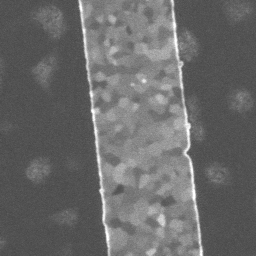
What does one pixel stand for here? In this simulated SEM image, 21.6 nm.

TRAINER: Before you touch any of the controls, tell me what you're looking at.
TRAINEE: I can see one or a few lines or trenches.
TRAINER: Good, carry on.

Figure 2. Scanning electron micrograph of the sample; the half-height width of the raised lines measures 2000 nm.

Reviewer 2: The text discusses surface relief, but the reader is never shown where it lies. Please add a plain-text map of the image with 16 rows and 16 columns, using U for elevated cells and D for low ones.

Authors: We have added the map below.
DDDDDUUUUUUDDDDD
DDDDDUUUUUUDDDDD
DDDDDUUUUUUDDDDD
DDDDDUUUUUUDDDDD
DDDDDUUUUUUDDDDD
DDDDDDUUUUUDDDDD
DDDDDDUUUUUUDDDD
DDDDDDUUUUUUDDDD
DDDDDDUUUUUUDDDD
DDDDDDUUUUUUDDDD
DDDDDDUUUUUUDDDD
DDDDDDUUUUUUDDDD
DDDDDDUUUUUUDDDD
DDDDDDUUUUUUDDDD
DDDDDDDUUUUUDDDD
DDDDDDDUUUUUUDDD